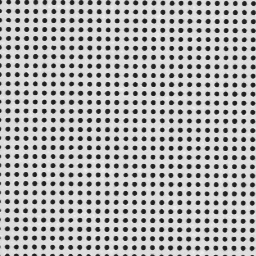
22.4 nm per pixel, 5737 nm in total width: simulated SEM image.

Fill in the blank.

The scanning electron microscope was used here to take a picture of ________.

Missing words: a regular array of holes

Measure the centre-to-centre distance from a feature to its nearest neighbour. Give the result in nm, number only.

202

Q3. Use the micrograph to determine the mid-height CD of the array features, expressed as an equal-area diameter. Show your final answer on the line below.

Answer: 5.05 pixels